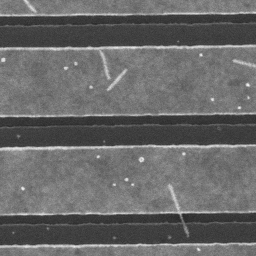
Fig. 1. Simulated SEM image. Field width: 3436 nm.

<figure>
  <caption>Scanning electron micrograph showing lines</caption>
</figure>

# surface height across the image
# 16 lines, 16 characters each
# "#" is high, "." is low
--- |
################
................
................
################
################
################
################
................
................
################
################
################
################
................
................
################